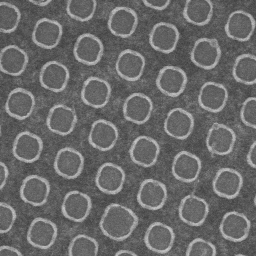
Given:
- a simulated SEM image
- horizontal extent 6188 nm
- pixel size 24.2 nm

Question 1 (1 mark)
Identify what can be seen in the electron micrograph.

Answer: a regular array of raised bodies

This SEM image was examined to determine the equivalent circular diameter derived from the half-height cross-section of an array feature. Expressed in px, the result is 27.7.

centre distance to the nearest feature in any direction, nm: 1050